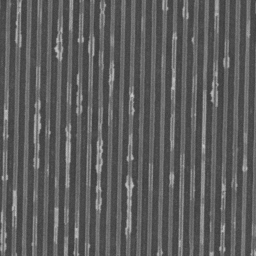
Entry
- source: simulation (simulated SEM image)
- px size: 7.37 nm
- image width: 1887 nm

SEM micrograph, parallel lines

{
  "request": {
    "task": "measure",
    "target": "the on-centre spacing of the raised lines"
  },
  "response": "76.9 nm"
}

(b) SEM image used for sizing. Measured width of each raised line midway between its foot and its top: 28.5 nanometres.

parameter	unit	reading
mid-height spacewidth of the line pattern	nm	49.7